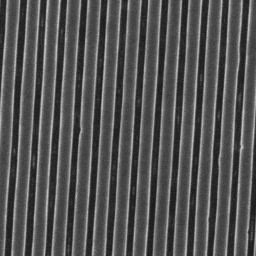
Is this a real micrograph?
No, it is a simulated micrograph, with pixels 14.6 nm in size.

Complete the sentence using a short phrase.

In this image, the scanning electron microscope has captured parallel lines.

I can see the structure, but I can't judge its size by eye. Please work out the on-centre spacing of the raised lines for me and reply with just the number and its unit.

20.2 pixels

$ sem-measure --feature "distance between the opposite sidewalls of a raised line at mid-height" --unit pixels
12.7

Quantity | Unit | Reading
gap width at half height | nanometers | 108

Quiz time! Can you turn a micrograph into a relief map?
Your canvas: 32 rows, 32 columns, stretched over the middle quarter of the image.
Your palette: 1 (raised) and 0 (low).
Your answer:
11100111001110011100111001110001
11100111001110011100111001110011
11100111001110011100111001110011
11100111001110011100111001110011
11100111001110011100111001110011
11100111001110011100111001110011
11100111001110011100111001110011
11100111001110011100111001110011
11100111001110011100111001110011
11100111001110011100111001110011
11001110001110011100111001110011
11001110011100011100111001110011
11001110011100111001110001110011
11001110011100111001110011100011
11001110011100111001110011100011
11001110011100111001110011100011
11001110011100111001110011100011
11001110011100111001110011100111
11001110011100111001110011100111
11001110011100111001110011100111
11001110011100111001110011100111
11001110011100111001110011100111
11001110011100111001110011100111
11011110011100111001110011100111
11011110011100111001110011100111
11001110011100111001110011100111
10011110011100111001110011100111
10011100111000111001110011100111
10011100111001110011100011100111
10011100111001110011100111000111
10011100111001110011100111001110
10011100111001110011100111001110